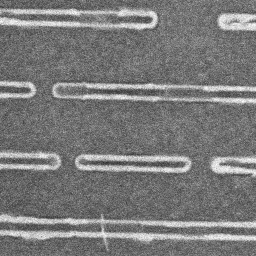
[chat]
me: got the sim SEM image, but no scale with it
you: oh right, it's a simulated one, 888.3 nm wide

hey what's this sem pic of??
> one or a few lines or trenches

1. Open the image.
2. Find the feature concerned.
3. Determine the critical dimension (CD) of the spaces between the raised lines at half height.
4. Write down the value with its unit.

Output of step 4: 195 nm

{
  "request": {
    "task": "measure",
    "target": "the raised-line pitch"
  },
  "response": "242 nm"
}